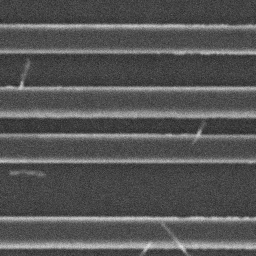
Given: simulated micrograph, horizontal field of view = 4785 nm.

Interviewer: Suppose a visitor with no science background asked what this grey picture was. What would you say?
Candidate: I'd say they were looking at lines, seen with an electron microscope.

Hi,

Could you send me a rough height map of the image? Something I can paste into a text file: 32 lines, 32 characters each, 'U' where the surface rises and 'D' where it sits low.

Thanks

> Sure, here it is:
DDDDDDDDDDDDDDDDDDDDDDDDDDDDDDDD
DDDDDDDDDDDDDDDDDDDDDDDDDDDDDDDD
DDDDDDDDDDDDDDDDDDDDDDDDDDDDDDDD
UUUUUUUUUUUUUUUUUUUUUUUUUUUUUUUU
UUUUUUUUUUUUUUUUUUUUUUUUUUUUUUUU
UUUUUUUUUUUUUUUUUUUUUUUUUUUUUUUU
UUUUUUUUUUUUUUUUUUUUUUUUUUUUUUUU
DDDDDDDDDDDDDDDDDDDDDDDDDDDDDDDD
DDDDDDDDDDDDDDDDDDDDDDDDDDDDDDDD
DDDDDDDDDDDDDDDDDDDDDDDDDDDDDDDD
DDDDDDDDDDDDDDDDDDDDDDDDDDDDDDDD
UUUUUUUUUUUUUUUUUUUUUUUUUUUUUUUU
UUUUUUUUUUUUUUUUUUUUUUUUUUUUUUUU
UUUUUUUUUUUUUUUUUUUUUUUUUUUUUUUU
UUUUUUUUUUUUUUUUUUUUUUUUUUUUUUUU
DDDDDDDDDDDDDDDDDDDDDDDDDDDDDDDD
DDDDDDDDDDDDDDDDDDDDDDDDDDDDDDDD
UUUUUUUUUUUUUUUUUUUUUUUUUUUUUUUU
UUUUUUUUUUUUUUUUUUUUUUUUUUUUUUUU
UUUUUUUUUUUUUUUUUUUUUUUUUUUUUUUU
DDDDDDDDDDDDDDDDDDDDDDDDDDDDDDDD
DDDDDDDDDDDDDDDDDDDDDDDDDDDDDDDD
DDDDDDDDDDDDDDDDDDDDDDDDDDDDDDDD
DDDDDDDDDDDDDDDDDDDDDDDDDDDDDDDD
DDDDDDDDDDDDDDDDDDDDDDDDDDDDDDDD
DDDDDDDDDDDDDDDDDDDDDDDDDDDDDDDD
DDDDDDDDDDDDDDDDDDDDDDDDDDDDDDDD
UUUUUUUUUUUUUUUUUUUUUUUUUUUUUUUU
UUUUUUUUUUUUUUUUUUUUUUUUUUUUUUUU
UUUUUUUUUUUUUUUUUUUUUUUUUUUUUUUU
UUUUUUUUUUUUUUUUUUUUUUUUUUUUUUUU
DDDDDDDDDDDDDDDDDDDDDDDDDDDDDDDD